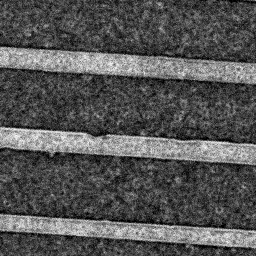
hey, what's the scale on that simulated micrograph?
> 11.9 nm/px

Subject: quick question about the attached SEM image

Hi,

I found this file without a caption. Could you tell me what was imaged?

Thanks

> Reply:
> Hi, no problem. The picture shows one or a few lines or trenches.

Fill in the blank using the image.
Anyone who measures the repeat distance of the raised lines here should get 82.6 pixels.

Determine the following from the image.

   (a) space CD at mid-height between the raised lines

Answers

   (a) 743 nanometers